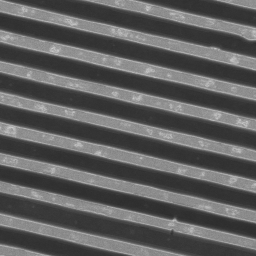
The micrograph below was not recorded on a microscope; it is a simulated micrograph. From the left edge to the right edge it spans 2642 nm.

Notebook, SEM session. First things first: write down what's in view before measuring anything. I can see parallel lines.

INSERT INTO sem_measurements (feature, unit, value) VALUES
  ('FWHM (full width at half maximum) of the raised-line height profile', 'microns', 0.145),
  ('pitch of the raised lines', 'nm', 305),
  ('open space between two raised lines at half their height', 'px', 15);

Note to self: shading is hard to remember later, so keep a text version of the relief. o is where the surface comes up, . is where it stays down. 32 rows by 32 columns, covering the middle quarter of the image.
........ooooooooooooooooo.......
............oooooooooooooooooo..
.................ooooooooooooooo
oooo.................ooooooooooo
oooooooo.................ooooooo
oooooooooooooo.................o
..oooooooooooooooo..............
......oooooooooooooooo..........
..........oooooooooooooooo......
...............ooooooooooooooo..
o..................ooooooooooooo
ooooo..................ooooooooo
ooooooooooo.................oooo
ooooooooooooooo.................
...ooooooooooooooo..............
.......oooooooooooooooo.........
............ooooooooooooooo.....
................ooooooooooooooo.
ooo.................oooooooooooo
oooooooo.................ooooooo
oooooooooooo.................ooo
oooooooooooooooo................
.....oooooooooooooooo...........
.........oooooooooooooooo.......
.............ooooooooooooooo....
o................ooooooooooooooo
ooooo.................oooooooooo
ooooooooo..................ooooo
ooooooooooooo.................oo
..oooooooooooooooo..............
.......ooooooooooooooo..........
...........ooooooooooooooo......